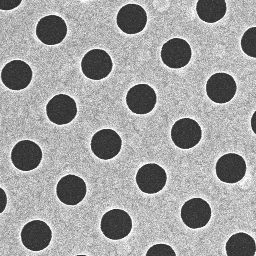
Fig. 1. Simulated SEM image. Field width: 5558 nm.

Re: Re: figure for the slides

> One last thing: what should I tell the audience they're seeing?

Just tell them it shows a regular array of holes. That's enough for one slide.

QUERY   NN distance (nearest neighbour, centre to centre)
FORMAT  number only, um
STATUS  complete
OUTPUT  1.23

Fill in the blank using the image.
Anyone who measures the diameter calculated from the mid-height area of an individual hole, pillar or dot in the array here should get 31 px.